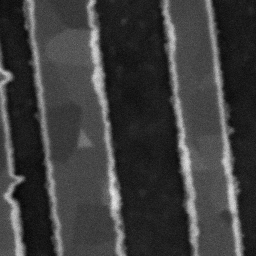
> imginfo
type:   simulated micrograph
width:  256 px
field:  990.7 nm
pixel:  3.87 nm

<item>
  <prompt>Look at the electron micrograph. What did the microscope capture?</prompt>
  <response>one or a few lines or trenches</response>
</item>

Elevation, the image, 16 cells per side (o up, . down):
..oooo....ooo...
..oooo.....oo...
..oooo.....oo...
..oooo.....oo...
..oooo.....ooo..
..oooo.....ooo..
...ooo.....ooo..
...oooo....ooo..
...oooo....ooo..
o..oooo....ooo..
o..oooo.....oo..
o..oooo.....oo..
o..oooo.....ooo.
o..oooo.....ooo.
o...ooo.....ooo.
o...ooo.....ooo.